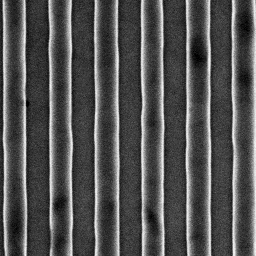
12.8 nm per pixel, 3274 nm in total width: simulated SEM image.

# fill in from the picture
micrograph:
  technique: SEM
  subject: wiring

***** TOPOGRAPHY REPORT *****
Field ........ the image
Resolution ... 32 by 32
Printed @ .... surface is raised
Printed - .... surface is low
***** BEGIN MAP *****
@@@---@@@---@@@---@@---@@@---@@@
@@@---@@@---@@@---@@---@@@---@@@
-@@---@@@---@@@---@@---@@@---@@@
-@@---@@@---@@@---@@---@@@---@@@
-@@---@@@---@@@---@@---@@@---@@@
-@@---@@@---@@@---@@---@@@---@@@
@@@---@@@---@@@---@@---@@@---@@@
@@@---@@@---@@@---@@---@@@---@@@
-@@---@@@---@@@---@@---@@@---@@@
-@@---@@@---@@@---@@---@@@---@@@
-@@---@@@---@@@---@@---@@@---@@@
-@@---@@@---@@@---@@---@@@---@@@
-@@---@@@---@@@---@@---@@@---@@@
-@@---@@@---@@@---@@---@@@---@@@
-@@---@@@---@@@---@@---@@@---@@@
-@@---@@@---@@@---@@---@@@---@@@
@@@---@@@---@@@---@@---@@@---@@@
@@@---@@@---@@@---@@---@@@---@@@
-@@---@@@---@@@---@@---@@@---@@@
-@@---@@@---@@@---@@---@@@---@@@
-@@---@@@---@@@---@@---@@@---@@@
-@@---@@@---@@@---@@---@@@---@@@
-@@---@@@---@@@---@@---@@@---@@@
-@@---@@@---@@@---@@---@@@---@@@
-@@---@@@---@@@---@@---@@@---@@@
-@@---@@@---@@@---@@---@@@---@@@
-@@---@@@---@@@---@@---@@@---@@@
-@@---@@@---@@@---@@---@@@---@@@
-@@---@@@---@@@---@@---@@@---@@@
-@@---@@@---@@@---@@---@@@---@@@
-@@---@@@---@@@---@@---@@@---@@@
-@@---@@@---@@@---@@----@@---@@@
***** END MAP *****